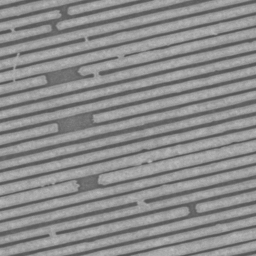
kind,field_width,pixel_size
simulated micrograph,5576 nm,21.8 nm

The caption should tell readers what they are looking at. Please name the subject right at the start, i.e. parallel lines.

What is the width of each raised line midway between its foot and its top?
0.186 micrometres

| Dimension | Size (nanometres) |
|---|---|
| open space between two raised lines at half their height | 93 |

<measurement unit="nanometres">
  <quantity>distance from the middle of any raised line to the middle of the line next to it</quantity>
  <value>267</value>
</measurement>